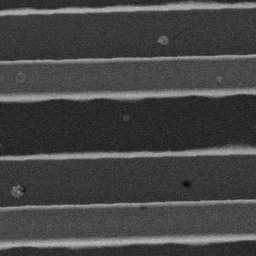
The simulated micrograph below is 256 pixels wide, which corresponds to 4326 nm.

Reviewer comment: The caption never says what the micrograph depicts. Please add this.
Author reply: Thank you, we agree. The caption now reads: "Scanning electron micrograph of lines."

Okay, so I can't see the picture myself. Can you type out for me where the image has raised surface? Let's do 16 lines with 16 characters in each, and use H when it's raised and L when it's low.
LLLLLLLLLLLLLHHH
HHHHHHHHHHHHHHHH
HHHHHHHHHHHHHHHH
HHHHHHHHHHHHHHHH
HHHHHHHHHHHHHHHH
HHHHHHHHHHHHHHHH
LLLLLLLLLLLLLLLL
LLLLLLLLLLLLLLLL
LLLLLLLLLLLLLLLL
LLLLLLLLLLLLLLLL
HHHHHHHHHHHHHHHH
HHHHHHHHHHHHHHHH
HHHHHHHHHHHHHHHH
HHHHHHHHHHHHHHHH
HHHHHHHHHHHHHHHH
LLLLLLLLLLLLLLLL